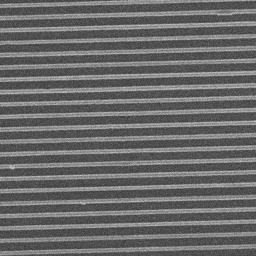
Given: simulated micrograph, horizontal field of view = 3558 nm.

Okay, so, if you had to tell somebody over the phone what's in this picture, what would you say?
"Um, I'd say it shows parallel lines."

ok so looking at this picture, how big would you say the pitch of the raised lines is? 172 nm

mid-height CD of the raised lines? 0.0504 µm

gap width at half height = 125 nm